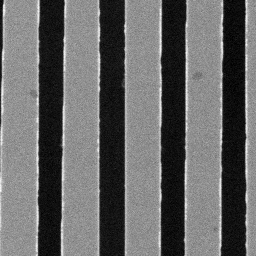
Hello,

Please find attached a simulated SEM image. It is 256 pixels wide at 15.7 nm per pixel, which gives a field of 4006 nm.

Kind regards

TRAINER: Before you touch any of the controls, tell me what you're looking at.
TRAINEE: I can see lines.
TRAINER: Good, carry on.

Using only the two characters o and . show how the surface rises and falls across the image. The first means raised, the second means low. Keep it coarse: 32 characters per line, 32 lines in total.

ooooo...oooo....oooo...ooooo...o
ooooo...oooo....oooo...ooooo...o
ooooo...oooo....oooo...ooooo...o
ooooo...oooo....oooo...ooooo...o
ooooo...oooo....oooo...ooooo...o
ooooo...oooo....oooo...ooooo...o
ooooo...oooo....oooo...ooooo...o
ooooo...oooo....oooo...ooooo...o
ooooo...oooo....oooo...ooooo...o
ooooo...oooo....oooo...ooooo...o
ooooo...oooo....oooo...ooooo...o
ooooo...oooo....oooo...ooooo...o
ooooo...oooo....oooo...ooooo...o
ooooo...oooo....oooo...ooooo...o
ooooo...oooo....oooo...ooooo...o
ooooo...oooo....oooo...ooooo...o
ooooo...oooo....oooo...ooooo...o
ooooo...oooo....oooo...ooooo...o
ooooo...oooo....oooo...ooooo...o
ooooo...oooo....oooo...ooooo...o
ooooo...oooo....oooo...ooooo...o
ooooo...oooo....oooo...ooooo...o
ooooo...oooo....oooo...ooooo...o
ooooo...oooo....oooo...ooooo...o
ooooo...oooo....oooo...ooooo...o
ooooo...oooo....oooo...ooooo...o
ooooo...oooo....oooo...ooooo...o
ooooo...oooo....oooo...ooooo...o
ooooo...oooo....oooo...ooooo...o
ooooo...oooo....oooo...ooooo...o
ooooo...oooo....oooo...ooooo...o
ooooo...oooo....oooo...oooo....o